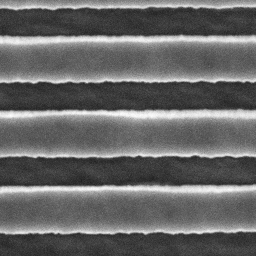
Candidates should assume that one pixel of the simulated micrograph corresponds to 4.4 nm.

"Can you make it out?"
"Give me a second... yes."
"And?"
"lines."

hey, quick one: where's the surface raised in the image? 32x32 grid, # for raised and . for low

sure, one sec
################################
................................
................................
................................
................................
################################
################################
################################
################################
################################
................................
................................
................................
................................
################################
################################
################################
################################
################################
###############.#.###.##.###.###
................................
................................
................................
################################
################################
################################
################################
################################
################################
................................
................................
................................